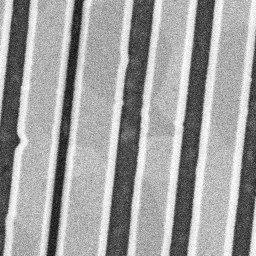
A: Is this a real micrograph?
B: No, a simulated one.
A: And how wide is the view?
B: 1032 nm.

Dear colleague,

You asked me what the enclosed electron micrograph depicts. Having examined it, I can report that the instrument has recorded one or a few lines or trenches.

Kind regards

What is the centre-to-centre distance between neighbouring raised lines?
246 nm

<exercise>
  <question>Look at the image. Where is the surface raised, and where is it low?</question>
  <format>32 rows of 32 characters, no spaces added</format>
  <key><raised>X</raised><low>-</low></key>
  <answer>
X---XXXXX--XXXXX----XXXX---XXXXX
X---XXXXX--XXXXX----XXXX---XXXXX
X---XXXXX--XXXXX---XXXXX---XXXXX
X---XXXXX-XXXXXX---XXXXX---XXXXX
X---XXXX--XXXXXX---XXXXX---XXXXX
X---XXXX--XXXXXX---XXXXX---XXXX-
X---XXXX--XXXXXX---XXXXX---XXXX-
---XXXXX--XXXXXX---XXXX---XXXXX-
---XXXXX--XXXXX----XXXX---XXXXX-
---XXXXX--XXXXX----XXXX---XXXXX-
---XXXXX--XXXXX---XXXXX---XXXXX-
---XXXXX--XXXXX---XXXXX---XXXXX-
---XXXXX-XXXXXX---XXXXX---XXXXX-
---XXXX--XXXXXX---XXXXX---XXXXX-
---XXXX--XXXXXX---XXXXX---XXXX--
---XXXX--XXXXXX---XXXX----XXXX--
---XXXX--XXXXXX---XXXX---XXXXX--
---XXXX--XXXXX----XXXX---XXXXX--
--XXXXX--XXXXX----XXXX---XXXXX--
--XXXXX--XXXXX----XXXX---XXXXX--
--XXXXX--XXXXX----XXXX---XXXXX--
--XXXXX-XXXXXX---XXXXX---XXXXX--
--XXXX--XXXXXX---XXXXX---XXXXX--
--XXXX--XXXXXX---XXXXX---XXXX---
--XXXX--XXXXXX---XXXXX---XXXX---
--XXXX--XXXXX----XXXX---XXXXX---
-XXXXX--XXXXX----XXXX---XXXXX---
-XXXXX--XXXXX----XXXX---XXXXX---
-XXXXX--XXXXX----XXXX---XXXXX---
-XXXXX--XXXXX----XXXX---XXXXX---
-XXXXX-XXXXXX---XXXXX---XXXXX---
-XXXX--XXXXXX---XXXXX---XXXXX---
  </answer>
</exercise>